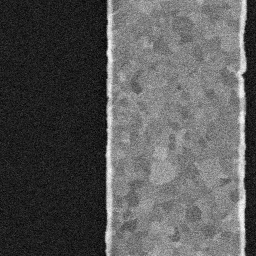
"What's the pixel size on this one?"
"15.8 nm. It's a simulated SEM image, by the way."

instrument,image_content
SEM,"one or a few lines or trenches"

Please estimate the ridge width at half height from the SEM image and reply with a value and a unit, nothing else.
2100 nm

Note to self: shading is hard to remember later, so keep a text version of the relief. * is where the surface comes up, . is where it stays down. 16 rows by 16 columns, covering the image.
.......********.
.......********.
.......********.
.......********.
.......********.
.......********.
.......********.
.......********.
.......********.
.......********.
.......********.
.......********.
.......********.
.......********.
.......********.
.......********.